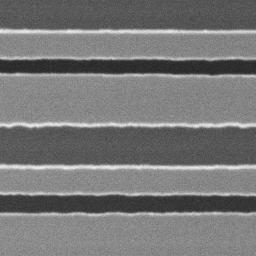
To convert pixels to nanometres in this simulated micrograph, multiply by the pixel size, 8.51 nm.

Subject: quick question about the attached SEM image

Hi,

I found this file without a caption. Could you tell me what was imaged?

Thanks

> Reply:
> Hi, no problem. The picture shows lines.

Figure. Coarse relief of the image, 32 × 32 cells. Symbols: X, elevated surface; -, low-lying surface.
--------------------------------
--------------------------------
--------------------------------
--------------------------------
XXXXXXXXXXXXXXXXXXXXXXXXXXXXXXXX
XXXXXXXXXXXXXXXXXXXXXXXXXXXXXXXX
XXXXXXXXXXXXXXXXXXXXXXXXXXXXXXXX
--------------------------------
--------------------------------
XXXXXXXXXXXXXXXXXXXXXXXXXX-XXXXX
XXXXXXXXXXXXXXXXXXXXXXXXXXXXXXXX
XXXXXXXXXXXXXXXXXXXXXXXXXXXXXXXX
XXXXXXXXXXXXXXXXXXXXXXXXXXXXXXXX
XXXXXXXXXXXXXXXXXXXXXXXXXXXXXXXX
XXXXXXXXXXXXXXXXXXXXXXXXXXXXXXXX
XXXXXXXXXXXXXXXXXXXXXXXXXXXXXXXX
--------------------------------
--------------------------------
--------------------------------
--------------------------------
--------------------------------
XXXXXXXXXXXXXXXXXXXXXXXXXXXXXXXX
XXXXXXXXXXXXXXXXXXXXXXXXXXXXXXXX
XXXXXXXXXXXXXXXXXXXXXXXXXXXXXXXX
--------------------------------
--------------------------------
--------------------------------
XXXXXXXXXXXXXXXXXXXXXXXXXXXXXXXX
XXXXXXXXXXXXXXXXXXXXXXXXXXXXXXXX
XXXXXXXXXXXXXXXXXXXXXXXXXXXXXXXX
XXXXXXXXXXXXXXXXXXXXXXXXXXXXXXXX
XXXXXXXXXXXXXXXXXXXXXXXXXXXXXXXX